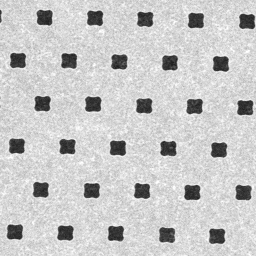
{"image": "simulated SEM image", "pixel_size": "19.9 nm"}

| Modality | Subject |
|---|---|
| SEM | a regular array of holes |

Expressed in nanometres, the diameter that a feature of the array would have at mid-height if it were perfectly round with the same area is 347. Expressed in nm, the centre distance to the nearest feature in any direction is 986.